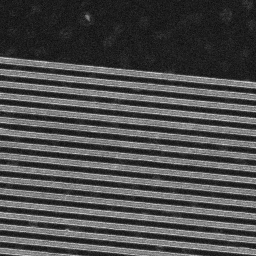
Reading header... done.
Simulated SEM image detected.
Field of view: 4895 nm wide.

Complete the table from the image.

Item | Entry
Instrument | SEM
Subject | parallel lines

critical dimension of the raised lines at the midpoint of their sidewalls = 140 nanometers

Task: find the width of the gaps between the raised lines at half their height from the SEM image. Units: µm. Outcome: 0.0856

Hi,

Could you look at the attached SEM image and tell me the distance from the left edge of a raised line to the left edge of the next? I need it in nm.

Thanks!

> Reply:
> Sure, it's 227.